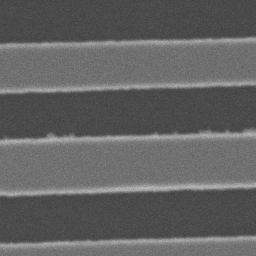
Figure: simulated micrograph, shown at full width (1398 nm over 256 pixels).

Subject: lines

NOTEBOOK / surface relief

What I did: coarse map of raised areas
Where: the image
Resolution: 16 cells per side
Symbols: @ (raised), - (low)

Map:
----------------
----------------
------------@@@@
@@@@@@@@@@@@@@@@
@@@@@@@@@@@@@@@@
@@@@@@@@@@------
----------------
----------------
---------@@@@@@@
@@@@@@@@@@@@@@@@
@@@@@@@@@@@@@@@@
@@@@@@@@@@@@@@@@
----------------
----------------
----------------
@@@@@@@@@@@@@@@@